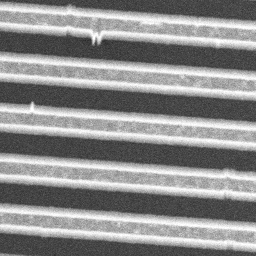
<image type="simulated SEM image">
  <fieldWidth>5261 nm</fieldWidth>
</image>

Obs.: parallel lines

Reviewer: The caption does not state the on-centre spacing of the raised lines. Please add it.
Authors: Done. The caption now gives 1.03 micrometres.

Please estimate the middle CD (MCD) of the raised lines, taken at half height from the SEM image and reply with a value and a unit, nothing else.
0.479 µm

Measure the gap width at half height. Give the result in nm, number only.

561